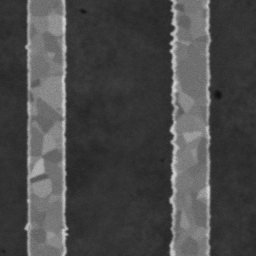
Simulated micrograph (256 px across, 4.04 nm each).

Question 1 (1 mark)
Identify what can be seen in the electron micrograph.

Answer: one or a few lines or trenches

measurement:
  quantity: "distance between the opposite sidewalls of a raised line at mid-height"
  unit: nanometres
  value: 143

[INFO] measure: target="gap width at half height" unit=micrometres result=0.44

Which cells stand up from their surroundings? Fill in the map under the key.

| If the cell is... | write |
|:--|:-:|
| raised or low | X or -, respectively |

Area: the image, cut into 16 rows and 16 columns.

--XX-------XX---
--XX-------XX---
--XX-------XX---
--XX-------XX---
--XX-------XX---
--XX-------XX---
--XX-------XX---
--XX-------XX---
--XX-------XX---
--XX-------XX---
--XX-------XX---
--XX-------XX---
--XX-------XX---
--XX-------XX---
--XX-------XX---
--XX-------XX---